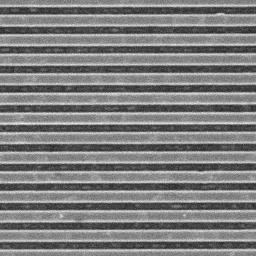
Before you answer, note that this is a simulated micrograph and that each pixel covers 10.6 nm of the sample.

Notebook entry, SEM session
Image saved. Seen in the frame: parallel lines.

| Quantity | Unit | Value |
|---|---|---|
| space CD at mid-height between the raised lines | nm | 90.4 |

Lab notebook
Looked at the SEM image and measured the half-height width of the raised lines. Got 118 nanometres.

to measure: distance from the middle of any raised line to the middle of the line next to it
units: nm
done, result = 208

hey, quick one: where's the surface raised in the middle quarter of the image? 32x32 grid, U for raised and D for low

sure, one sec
DDDDDDDDDDDDDDDDDDDDDDDDDDDDDDDD
DDDDDDDDDDDDDDDDDDDDDDDDDDDDDDDD
DDDDDDDUUUUUUUUUUUUUUUUUUUUUUUUU
UUUUUUUUUUUUUUUUUUUUUUUUUUUUUUUU
UUUUUUUUUUUUUUUUUUUUUUUUUUUUUUUU
DDDDDDDDDDDDDDDDDDDDDDDDDDDDDDDD
DDDDDDDDDDDDDDDDDDDDDDDDDDDDDDDD
UUUUUUUUUUUUUUUUUUUUUUUUUUUUUUUU
UUUUUUUUUUUUUUUUUUUUUUUUUUUUUUUU
UUUUUUUUUUUUUUUUUUUUUUUUUUUUUUUU
DDDDDDDDDDDDDDDDDDDDDDDDDDDDDDDD
DDDDDDDDDDDDDDDDDDDDDDDDDDDDDDDD
UUUUUUUUUUUUUUUUUUUUUUUUUUUUUUUU
UUUUUUUUUUUUUUUUUUUUUUUUUUUUUUUU
UUUUUUUUUUUUUUUUUUUUUUUUUUUUUUUU
DDDDDDDDDDDDDDDDDDDDDDDDDDDDDDDD
DDDDDDDDDDDDDDDDDDDDDDDDDDDDDDDD
UUUUUUUUUUUUUUUUUUUUUUUUUUUUUUUU
UUUUUUUUUUUUUUUUUUUUUUUUUUUUUUUU
UUUUUUUUUUUUUUUUUUUUUUUUUUUUUUUU
DDDDDDDDDDDDDDDDDDDDDDDDDDDDDDDD
DDDDDDDDDDDDDDDDDDDDDDDDDDDDDDDD
UUUUUUUUUUUUUUUUUUUUUUUUUUUUUUUU
UUUUUUUUUUUUUUUUUUUUUUUUUUUUUUUU
UUUUUUUUUUUUUUUUUUUUUUUUUUUUUUUU
DDDDDDDDDDDDDDDDDDDDDDDDDDDDDDDD
DDDDDDDDDDDDDDDDDDDDDDDDDDDDDDDD
UUUUUUUUUUUUUUUUUUUUUUUUUUUUUUUU
UUUUUUUUUUUUUUUUUUUUUUUUUUUUUUUU
UUUUUUUUUUUUUUUUUUUUDDDDDDDDDDDD
DDDDDDDDDDDDDDDDDDDDDDDDDDDDDDDD
DDDDDDDDDDDDDDDDDDDDDDDDDDDDDDDD